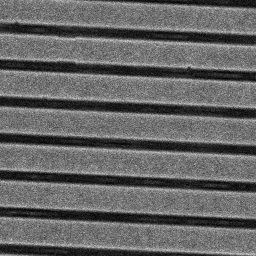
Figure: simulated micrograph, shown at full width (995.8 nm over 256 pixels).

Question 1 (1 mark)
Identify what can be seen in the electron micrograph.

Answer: parallel lines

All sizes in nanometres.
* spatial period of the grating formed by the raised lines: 143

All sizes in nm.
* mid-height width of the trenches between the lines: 41.3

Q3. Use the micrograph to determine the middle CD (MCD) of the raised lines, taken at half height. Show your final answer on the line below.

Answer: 104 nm